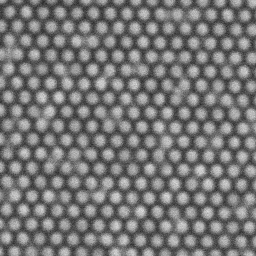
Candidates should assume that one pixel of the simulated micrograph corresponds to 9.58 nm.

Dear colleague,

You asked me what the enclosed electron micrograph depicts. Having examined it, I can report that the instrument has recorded a regular array of raised bodies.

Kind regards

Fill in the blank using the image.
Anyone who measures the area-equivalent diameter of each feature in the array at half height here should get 0.0997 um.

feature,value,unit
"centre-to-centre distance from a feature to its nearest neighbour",155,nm